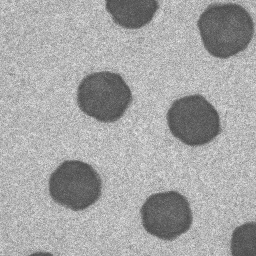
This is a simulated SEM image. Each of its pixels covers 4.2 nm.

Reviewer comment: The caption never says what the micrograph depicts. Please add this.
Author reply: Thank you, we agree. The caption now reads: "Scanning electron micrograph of holes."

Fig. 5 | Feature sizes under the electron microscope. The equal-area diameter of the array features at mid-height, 215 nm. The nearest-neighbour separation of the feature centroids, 392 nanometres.